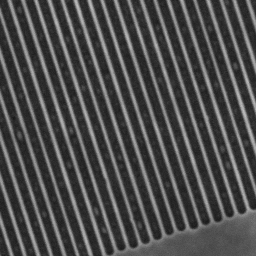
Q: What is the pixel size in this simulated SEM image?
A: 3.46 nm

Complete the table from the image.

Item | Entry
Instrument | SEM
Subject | parallel lines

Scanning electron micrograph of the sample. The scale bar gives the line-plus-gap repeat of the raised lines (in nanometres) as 43.6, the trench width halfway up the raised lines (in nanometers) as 32.1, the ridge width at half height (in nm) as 12.8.